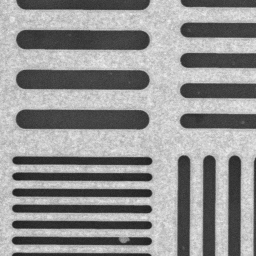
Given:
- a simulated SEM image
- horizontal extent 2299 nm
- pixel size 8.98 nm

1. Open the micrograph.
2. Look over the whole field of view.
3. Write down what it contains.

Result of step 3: groups of lines, slits or small figures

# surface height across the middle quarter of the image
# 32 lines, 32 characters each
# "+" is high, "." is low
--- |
++++++++++++++++++++++++++++++..
...................+++++++++++++
.....................+++++++++++
.....................+++++++++++
.....................+++++++++++
.....................++++++++...
...................++++++++++...
+++++++++++++++++++++++++++++...
++++++++++++++++++++++++++++++..
++++++++++++++++++++++++++++++++
++++++++++++++++++++++++++++++++
...................+++++++++++++
.....................+++++++++..
.....................++++++++...
.....................++++++++...
.....................++++++++...
...................+++++++++++++
++++++++++++++++++++++++++++++++
++++++++++++++++++++++++++++++++
++++++++++++++++++++++++++++++++
++++++++++++++++++++++++++++++++
++++++++++++++++++++++++++++++++
++++++++++++++++++++++++++++++++
......................+++++++..+
......................++++++....
+++++++++++++........+++++++....
++++++++++++++++++++++++++++....
......................++++++....
......................++++++....
++++++++++++++++++++++++++++....
++++++++++++++++++++++++++++....
......................++++++....